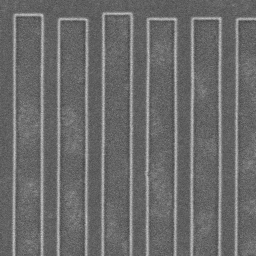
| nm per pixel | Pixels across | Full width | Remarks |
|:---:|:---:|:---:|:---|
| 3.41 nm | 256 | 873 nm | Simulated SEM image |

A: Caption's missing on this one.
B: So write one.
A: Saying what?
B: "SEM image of parallel lines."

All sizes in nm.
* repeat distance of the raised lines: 152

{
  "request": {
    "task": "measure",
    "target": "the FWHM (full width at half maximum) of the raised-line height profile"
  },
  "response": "56.6 nm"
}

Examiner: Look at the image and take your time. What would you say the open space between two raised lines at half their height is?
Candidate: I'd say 93.7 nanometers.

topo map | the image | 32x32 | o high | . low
oooooooooooooooooooooooooooooooo
oooooooooooooooooooooooooooooooo
oo...ooo..ooo...ooo..ooo...ooo..
oo...oo....oo...oo....oo....oo..
oo...oo....oo...oo....oo....oo..
oo...oo....oo...oo....oo....oo..
oo...oo....oo...ooo...oo....oo..
oo...oo....oo...ooo...oo....oo..
oo...oo....oo...ooo...oo....oo..
oo...oo....oo...oo....oo....oo..
oo...oo....oo...oo....oo....oo..
oo...oo....oo...oo....oo....oo..
oo...oo....oo...oo....oo...ooo..
oo...oo....oo...oo....oo...ooo..
oo...oo....oo...oo....oo...ooo..
oo...oo....oo...oo....oo...ooo..
oo...oo....oo...oo....oo...ooo..
oo...oo....oo...oo....oo...ooo..
oo...oo....oo...oo....oo...ooo..
oo...oo....oo...oo....oo...ooo..
oo...oo....oo...oo....oo....oo..
oo...oo....oo...oo....oo....oo..
oo...oo....oo...oo....oo....oo..
oo...oo....oo...oo....oo....oo..
oo...oo....oo...oo....oo...ooo..
oo...oo....oo...oo....oo...ooo..
oo...oo....oo...oo....oo...ooo..
oo...oo....oo...oo....oo...ooo..
oo...oo....oo...oo....oo...ooo..
oo...oo....oo...oo....oo...ooo..
oo...oo....oo...oo....oo...ooo..
oo...oo....oo...oo....oo...ooo..